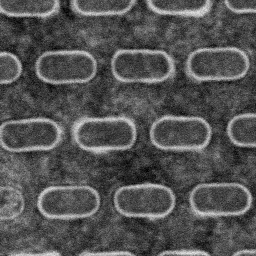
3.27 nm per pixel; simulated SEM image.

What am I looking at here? a regular array of raised bodies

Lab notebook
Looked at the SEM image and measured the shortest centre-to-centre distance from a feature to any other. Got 246 nanometers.